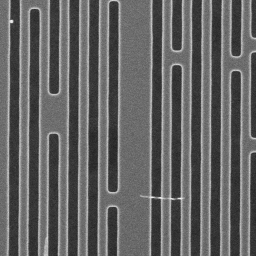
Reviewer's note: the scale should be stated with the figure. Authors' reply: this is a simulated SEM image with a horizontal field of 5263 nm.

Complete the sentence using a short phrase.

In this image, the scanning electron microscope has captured groups of lines, slits or small figures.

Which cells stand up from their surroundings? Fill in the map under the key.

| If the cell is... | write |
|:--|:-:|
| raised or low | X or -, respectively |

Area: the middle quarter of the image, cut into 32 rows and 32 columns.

X---XX---XX---XXXXXXXX---XX--XXX
X---XX---XX---XXXXXXXX---XX---XX
X---XX---XX---XXXXXXXX---XX---XX
X---XX---XX---XXXXXXXX---XX---XX
X---XX---XX---XXXXXXXX---XX---XX
X---XX---XX---XXXXXXXX---XX---XX
X---XX---XX---XXXXXXXX---XX---XX
X---XX---XX---XXXXXXXX---XX---XX
X---XX---XX---XXXXXXXX---XX---XX
X---XX---XX---XXXXXXXX---XX---XX
X---XX---XX---XXXXXXXX---XX---XX
X---XX---XX---XXXXXXXX---XX---XX
X---XX---XX---XXXXXXXX---XX---XX
X---XX---XX---XXXXXXXX---XX---XX
X---XX---XX---XXXXXXXX---XX---XX
X---XX---XX---XXXXXXXX---XX---XX
X---XX---XX---XXXXXXXX--XXX---XX
X---XX---XX---XXXXXXXX--XXX---XX
X---XX---XX---XXXXXXXX--XXX---XX
X---XX---XX---XXXXXXXX--XXX---XX
X---XX---XX---XXXXXXXX--XXX---XX
X---XX---XX---XXXXXXXX--XXX---XX
X---XX---XX---XXXXXXXX--XXX---XX
X---XX---XX---XXXXXXXX--XXX---XX
X---XX---XX---XXXXXXXX--XXX--XXX
X---XX---XX---XXXXXXXX--XXX--XXX
X---XX---XX---XXXXXXXX--XXX--XXX
X---XX---XX---XXXXXXXX--XXX--XXX
X---XX---XX---XXXXXXXX--XXX--XXX
X---XX---XX---XXXXXXXX--XXX--XXX
X---XX---XX---XXXXXXXX--XXX--XXX
X---XX---XX--XXXXXXXXX--XXX--XXX